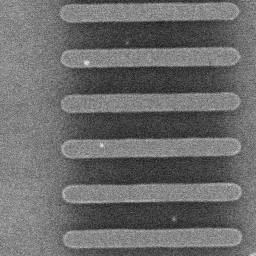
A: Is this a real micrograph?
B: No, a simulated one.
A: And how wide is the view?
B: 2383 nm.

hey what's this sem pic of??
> groups of lines, slits or small figures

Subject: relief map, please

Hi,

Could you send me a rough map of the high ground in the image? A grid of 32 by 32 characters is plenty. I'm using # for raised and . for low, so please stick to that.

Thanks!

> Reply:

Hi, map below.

....................###..####...
........######################..
........###########.............
................................
................................
................................
........######################..
........######################..
................................
................................
................................
................................
........######################..
........#####################...
................................
................................
................................
...............###############..
........######################..
........##############..........
................................
................................
................................
........######################..
........######################..
................................
................................
................................
................................
........######################..
........######################..
................................